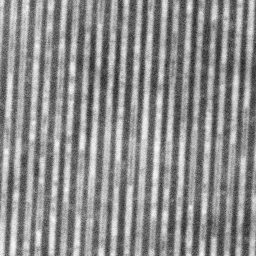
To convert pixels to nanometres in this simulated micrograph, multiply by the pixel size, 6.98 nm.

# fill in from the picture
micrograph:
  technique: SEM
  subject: parallel lines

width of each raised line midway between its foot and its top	31.4	nanometres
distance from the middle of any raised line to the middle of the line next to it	87.3	nanometres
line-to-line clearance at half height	56.7	nm